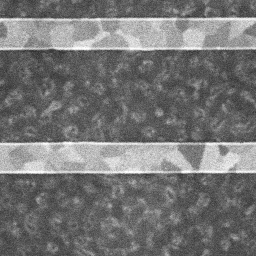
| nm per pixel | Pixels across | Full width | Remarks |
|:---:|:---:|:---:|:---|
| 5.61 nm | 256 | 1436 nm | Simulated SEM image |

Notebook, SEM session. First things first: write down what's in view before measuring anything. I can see one or a few lines or trenches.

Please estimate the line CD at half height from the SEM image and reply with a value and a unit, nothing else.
29 pixels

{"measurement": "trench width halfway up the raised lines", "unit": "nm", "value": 531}